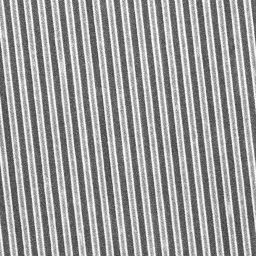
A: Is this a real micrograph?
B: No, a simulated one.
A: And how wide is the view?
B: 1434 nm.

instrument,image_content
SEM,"parallel lines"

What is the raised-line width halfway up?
0.0348 um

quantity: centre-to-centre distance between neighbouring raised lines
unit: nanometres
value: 76.6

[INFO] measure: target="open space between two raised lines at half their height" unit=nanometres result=39.6